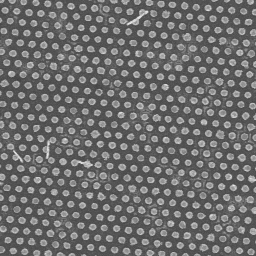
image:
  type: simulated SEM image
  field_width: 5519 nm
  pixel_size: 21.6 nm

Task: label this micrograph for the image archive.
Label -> a regular array of raised bodies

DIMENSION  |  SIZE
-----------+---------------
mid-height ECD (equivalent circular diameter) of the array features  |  138 nanometers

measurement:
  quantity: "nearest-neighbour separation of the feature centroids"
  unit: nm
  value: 249